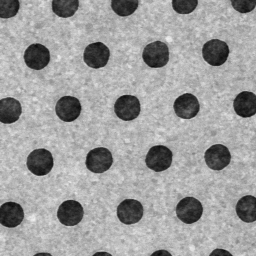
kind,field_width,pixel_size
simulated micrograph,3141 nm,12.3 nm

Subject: a regular array of holes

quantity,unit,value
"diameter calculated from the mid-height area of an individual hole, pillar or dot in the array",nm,335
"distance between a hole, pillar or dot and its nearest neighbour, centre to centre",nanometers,728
